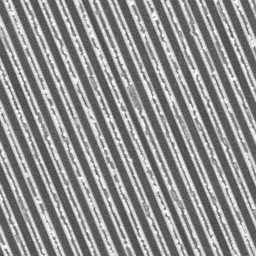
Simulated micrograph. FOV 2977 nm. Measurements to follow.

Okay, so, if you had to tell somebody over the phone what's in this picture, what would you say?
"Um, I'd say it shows parallel lines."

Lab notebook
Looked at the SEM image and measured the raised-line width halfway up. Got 7.39 px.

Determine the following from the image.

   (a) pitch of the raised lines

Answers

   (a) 188 nm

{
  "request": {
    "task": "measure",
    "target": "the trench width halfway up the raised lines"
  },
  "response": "0.109 micrometres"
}